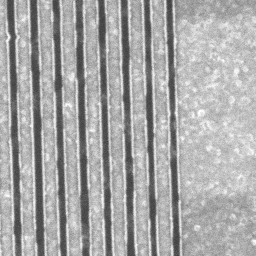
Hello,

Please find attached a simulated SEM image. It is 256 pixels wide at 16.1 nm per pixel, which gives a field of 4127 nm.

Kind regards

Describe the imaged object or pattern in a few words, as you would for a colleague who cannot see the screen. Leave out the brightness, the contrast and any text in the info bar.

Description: parallel lines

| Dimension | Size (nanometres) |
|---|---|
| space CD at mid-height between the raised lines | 195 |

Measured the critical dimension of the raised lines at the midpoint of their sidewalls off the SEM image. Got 0.163 micrometres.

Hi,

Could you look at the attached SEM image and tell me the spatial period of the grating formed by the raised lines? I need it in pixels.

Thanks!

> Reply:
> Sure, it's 22.6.